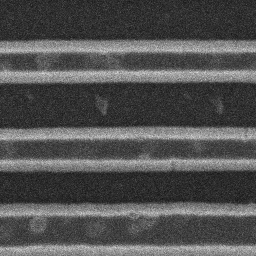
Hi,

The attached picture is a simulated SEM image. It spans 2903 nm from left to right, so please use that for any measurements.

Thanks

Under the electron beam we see one or a few lines or trenches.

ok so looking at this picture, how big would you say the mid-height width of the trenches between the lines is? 563 nanometres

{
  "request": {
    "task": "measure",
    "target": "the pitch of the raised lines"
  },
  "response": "959 nanometers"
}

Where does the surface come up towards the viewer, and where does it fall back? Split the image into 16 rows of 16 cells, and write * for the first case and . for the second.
................
................
................
****************
****************
................
................
................
****************
****************
................
................
................
****************
****************
****************